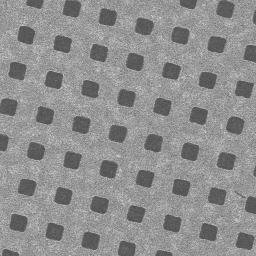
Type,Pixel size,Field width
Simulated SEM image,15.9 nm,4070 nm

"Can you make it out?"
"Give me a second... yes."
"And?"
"a regular array of holes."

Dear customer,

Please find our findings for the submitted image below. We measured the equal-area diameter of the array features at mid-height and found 0.287 micrometres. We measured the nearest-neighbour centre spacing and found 0.583 um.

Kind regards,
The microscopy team